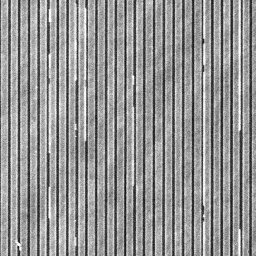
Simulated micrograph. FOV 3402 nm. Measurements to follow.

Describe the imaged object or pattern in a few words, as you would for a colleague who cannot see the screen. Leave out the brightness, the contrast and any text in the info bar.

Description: parallel lines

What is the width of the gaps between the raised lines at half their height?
39.9 nm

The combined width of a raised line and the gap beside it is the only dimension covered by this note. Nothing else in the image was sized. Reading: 128 nm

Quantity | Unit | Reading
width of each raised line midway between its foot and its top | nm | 91.4